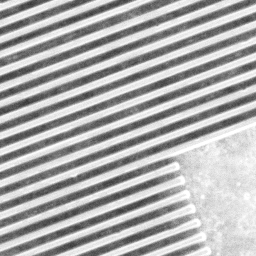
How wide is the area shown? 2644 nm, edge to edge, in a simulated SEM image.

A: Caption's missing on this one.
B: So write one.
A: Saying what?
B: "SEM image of parallel lines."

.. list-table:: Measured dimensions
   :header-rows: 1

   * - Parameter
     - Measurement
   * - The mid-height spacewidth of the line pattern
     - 92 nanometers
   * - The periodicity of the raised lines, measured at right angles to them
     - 0.155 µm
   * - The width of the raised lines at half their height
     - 71.4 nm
